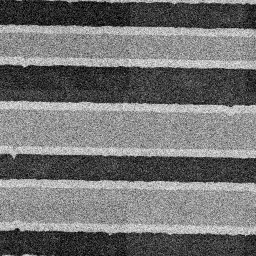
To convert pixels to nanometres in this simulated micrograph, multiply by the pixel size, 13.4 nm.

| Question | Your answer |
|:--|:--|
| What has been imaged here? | one or a few lines or trenches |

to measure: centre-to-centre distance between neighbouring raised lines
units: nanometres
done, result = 1070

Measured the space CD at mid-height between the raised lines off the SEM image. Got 435 nanometres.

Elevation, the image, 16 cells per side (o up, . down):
................
................
oooooooooooooooo
oooooooooooooooo
................
................
................
oooooooooooooooo
oooooooooooooooo
......oooooooooo
................
oooooooo........
oooooooooooooooo
oooooooooooooooo
................
................